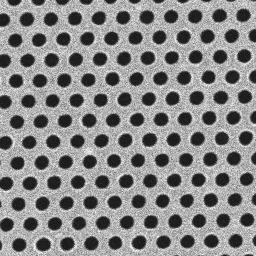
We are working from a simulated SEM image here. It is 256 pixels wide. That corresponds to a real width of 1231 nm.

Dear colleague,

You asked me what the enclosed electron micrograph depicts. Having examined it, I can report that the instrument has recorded a regular array of holes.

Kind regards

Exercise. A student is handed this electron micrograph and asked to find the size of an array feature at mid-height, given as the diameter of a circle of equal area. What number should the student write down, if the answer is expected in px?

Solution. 13.7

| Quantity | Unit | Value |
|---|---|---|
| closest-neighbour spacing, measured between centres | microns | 0.113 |